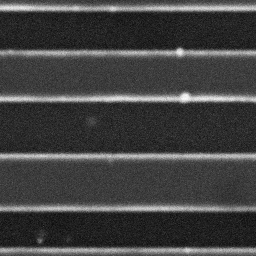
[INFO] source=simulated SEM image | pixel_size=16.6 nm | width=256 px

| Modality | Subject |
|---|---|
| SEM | lines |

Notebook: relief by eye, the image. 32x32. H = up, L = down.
HHHHHHHHHHHHHHHHHHHHHHHHHHHHHHHH
LLLLLLLLLLLLLLLLLLLLLLLLLLLLLLLL
LLLLLLLLLLLLLLLLLLLLLLLLLLLLLLLL
LLLLLLLLLLLLLLLLLLLLLLLLLLLLLLLL
LLLLLLLLLLLLLLLLLLLLLLLLLLLLLLLL
LLLLLLLLLLLLLLLLLLLLLLLLLLLLLLLL
HHHHHHHHHHHHHHHHHHHHHHHHHHHHHHHH
HHHHHHHHHHHHHHHHHHHHHHHHHHHHHHHH
HHHHHHHHHHHHHHHHHHHHHHHHHHHHHHHH
HHHHHHHHHHHHHHHHHHHHHHHHHHHHHHHH
HHHHHHHHHHHHHHHHHHHHHHHHHHHHHHHH
HHHHHHHHHHHHHHHHHHHHHHHHHHHHHHHH
HHHHHHHHHHHHLHLLHLLLLLHHHLLLHLHH
LLLLLLLLLLLLLLLLLLLLLLLLLLLLLLLL
LLLLLLLLLLLLLLLLLLLLLLLLLLLLLLLL
LLLLLLLLLLLLLLLLLLLLLLLLLLLLLLLL
LLLLLLLLLLLLLLLLLLLLLLLLLLLLLLLL
LLLLLLLLLLLLLLLLLLLLLLLLLLLLLLLL
LLLLLLLLLLLLLLLLLLLLLLLLLLLLLLLL
HHHHHHHHHHHHHHHHHHHHHHHHHHHHHHHH
HHHHHHHHHHHHHHHHHHHHHHHHHHHHHHHH
HHHHHHHHHHHHHHHHHHHHHHHHHHHHHHHH
HHHHHHHHHHHHHHHHHHHHHHHHHHHHHHHH
HHHHHHHHHHHHHHHHHHHHHHHHHHHHHHHH
HHHHHHHHHHHHHHHHHHHHHHHHHHHHHHHH
HHHHHHHHHHHHHHHHHHHHHHHHHHHHHHHH
LLLLLLLLLLLLLLLLLLLLLLLLLLLLLLLL
LLLLLLLLLLLLLLLLLLLLLLLLLLLLLLLL
LLLLLLLLLLLLLLLLLLLLLLLLLLLLLLLL
LLLLLLLLLLLLLLLLLLLLLLLLLLLLLLLL
LLLLLLLLLLLLLLLLLLLLLLLLLLLLLLLL
HHHHHHHHHHHHHHHHHHHHHHHHHHHHHHHH